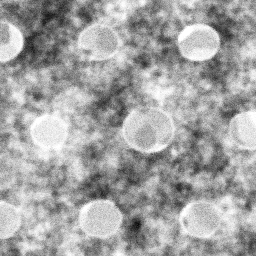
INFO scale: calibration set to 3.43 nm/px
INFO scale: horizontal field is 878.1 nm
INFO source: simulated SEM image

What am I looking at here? raised bodies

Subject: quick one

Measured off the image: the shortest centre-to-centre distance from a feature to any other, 0.345 micrometres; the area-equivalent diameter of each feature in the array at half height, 37.4 pixels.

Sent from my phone